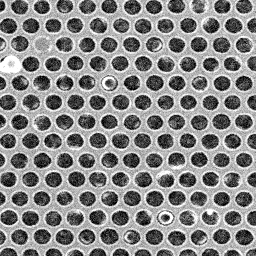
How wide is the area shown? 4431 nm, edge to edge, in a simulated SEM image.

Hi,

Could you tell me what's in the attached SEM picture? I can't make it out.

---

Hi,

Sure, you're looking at a regular array of holes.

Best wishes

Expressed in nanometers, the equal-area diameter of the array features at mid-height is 292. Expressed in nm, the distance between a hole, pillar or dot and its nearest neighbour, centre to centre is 375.